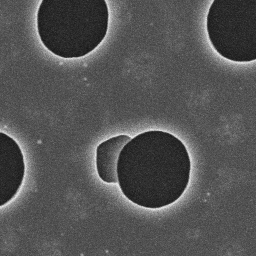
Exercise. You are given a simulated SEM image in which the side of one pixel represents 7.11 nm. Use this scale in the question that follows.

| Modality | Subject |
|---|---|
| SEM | holes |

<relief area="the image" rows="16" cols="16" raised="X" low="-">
XX-----XXXXXX---
XX-----XXXXXX---
XXX---XXXXXXX---
XXXX-XXXXXXXXX--
XXXXXXXXXXXXXXXX
XXXXXXXXXXXXXXXX
XXXXXXXXXXXXXXXX
XXXXXXXXXXXXXXXX
XXXXXXX----XXXXX
-XXXXX------XXXX
--XXXX------XXXX
-XXXXXX-----XXXX
-XXXXXXX---XXXXX
XXXXXXXXXXXXXXXX
XXXXXXXXXXXXXXXX
XXXXXXXXXXXXXXXX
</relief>